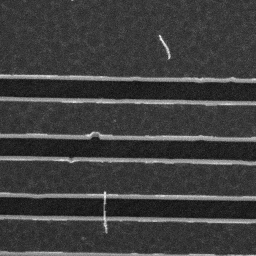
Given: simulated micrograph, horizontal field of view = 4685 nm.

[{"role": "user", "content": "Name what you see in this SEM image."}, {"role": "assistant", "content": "parallel lines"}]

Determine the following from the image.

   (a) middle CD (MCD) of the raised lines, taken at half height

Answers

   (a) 684 nm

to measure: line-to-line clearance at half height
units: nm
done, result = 387